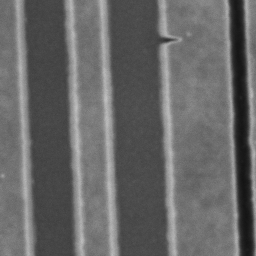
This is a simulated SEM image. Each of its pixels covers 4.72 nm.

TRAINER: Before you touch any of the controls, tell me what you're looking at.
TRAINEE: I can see one or a few lines or trenches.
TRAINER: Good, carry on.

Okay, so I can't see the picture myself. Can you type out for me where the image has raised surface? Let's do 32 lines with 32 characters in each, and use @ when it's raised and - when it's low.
@@@------@@@@-------@@@@@@@@@-@@
@@@------@@@@-------@@@@@@@@@-@@
@@@------@@@@-------@@@@@@@@@-@@
@@@------@@@@-------@@@@@@@@@--@
@@@------@@@@--------@@@@@@@@--@
@@@------@@@@--------@@@@@@@@--@
@@@------@@@@-------@@@@@@@@@--@
@@@------@@@@--------@@@@@@@@--@
@@@------@@@@--------@@@@@@@@--@
@@@------@@@@--------@@@@@@@@--@
@@@------@@@@--------@@@@@@@@--@
@@@------@@@@@-------@@@@@@@@--@
@@@------@@@@@-------@@@@@@@@--@
@@@------@@@@@-------@@@@@@@@--@
@@@------@@@@@-------@@@@@@@@--@
@@@------@@@@@-------@@@@@@@@--@
@@@------@@@@@-------@@@@@@@@--@
@@@------@@@@@-------@@@@@@@@--@
@@@------@@@@@-------@@@@@@@@--@
@@@------@@@@@-------@@@@@@@@--@
@@@------@@@@@-------@@@@@@@@@-@
@@@------@@@@@-------@@@@@@@@@-@
@@@-------@@@@-------@@@@@@@@@-@
@@@@------@@@@-------@@@@@@@@@-@
@@@@------@@@@-------@@@@@@@@@-@
@@@@------@@@@-------@@@@@@@@@-@
@@@@------@@@@-------@@@@@@@@@--
@@@@------@@@@-------@@@@@@@@@--
@@@@------@@@@-------@@@@@@@@@--
@@@@------@@@@-------@@@@@@@@@--
@@@@------@@@@-------@@@@@@@@@--
@@@@------@@@@--------@@@@@@@@--